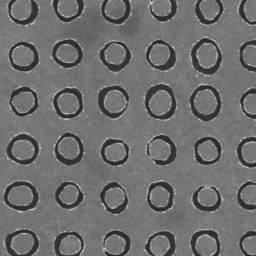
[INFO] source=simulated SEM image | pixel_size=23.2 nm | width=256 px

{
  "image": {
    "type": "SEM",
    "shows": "a regular array of ring-shaped grooves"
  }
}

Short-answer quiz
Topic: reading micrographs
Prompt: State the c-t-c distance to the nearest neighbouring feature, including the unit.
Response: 1050 nm